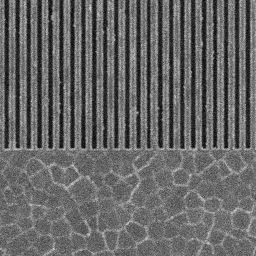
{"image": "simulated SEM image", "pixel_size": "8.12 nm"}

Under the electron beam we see parallel lines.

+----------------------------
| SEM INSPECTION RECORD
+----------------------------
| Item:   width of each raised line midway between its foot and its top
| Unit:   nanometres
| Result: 45.7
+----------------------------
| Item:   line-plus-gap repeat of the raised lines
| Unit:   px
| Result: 11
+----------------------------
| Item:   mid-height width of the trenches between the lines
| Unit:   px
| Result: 5.63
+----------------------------